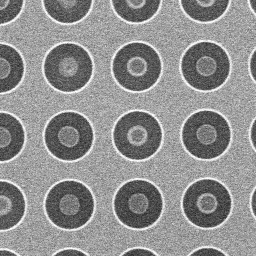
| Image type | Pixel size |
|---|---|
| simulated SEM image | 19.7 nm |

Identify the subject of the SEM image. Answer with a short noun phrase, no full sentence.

an array of small figures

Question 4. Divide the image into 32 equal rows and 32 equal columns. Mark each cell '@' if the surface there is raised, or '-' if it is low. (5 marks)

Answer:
---@@------@@@------@@@------@@-
---@@@-----@@@------@@@-----@@@@
--@@@@@---@@@@@@--@@@@@@---@@@@@
@@@@@@@@@@@@@@@@@@@@@@@@@@@@@@@@
@@@@@@@@@@@@@@@@@@@@@@@@@@@@@@@@
-@@@@@@@--@@@@@@--@@@@@@---@@@@@
--@@@@-----@@@@-----@@@-----@@@@
---@@@-----@@@------@@@------@@-
---@@-------@@------@@@------@@-
---@@@-----@@@------@@@------@@-
--@@@@-----@@@@----@@@@@----@@@@
-@@@@@@@-@@@@@@@@@@@@@@@@@@@@@@@
@@@@@@@@@@@@@@@@@@@@@@@@@@@@@@@@
@@@@@@@@@@@@@@@@@@@@@@@@@@@@@@@@
--@@@@@---@@@@@----@@@@@----@@@@
---@@@-----@@@------@@@------@@@
---@@@------@@------@@@------@@-
---@@@------@@------@@@------@@-
---@@@-----@@@@-----@@@-----@@@@
--@@@@@---@@@@@----@@@@@---@@@@@
@@@@@@@@@@@@@@@@@@@@@@@@@@@@@@@@
@@@@@@@@@@@@@@@@@@@@@@@@@@@@@@@@
@@@@@@@@@@@@@@@@@-@@@@@@@--@@@@@
--@@@@-----@@@@-----@@@-----@@@@
---@@@------@@------@@@------@@-
---@@@------@@------@@@------@@-
---@@@------@@------@@@------@@@
---@@@-----@@@@-----@@@@----@@@@
-@@@@@@@--@@@@@@--@@@@@@@@@@@@@@
@@@@@@@@@@@@@@@@@@@@@@@@@@@@@@@@
@@@@@@@@@@@@@@@@@@@@@@@@@@@@@@@@
--@@@@@---@@@@@@---@@@@@----@@@@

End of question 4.